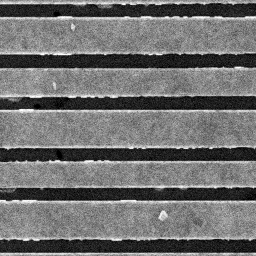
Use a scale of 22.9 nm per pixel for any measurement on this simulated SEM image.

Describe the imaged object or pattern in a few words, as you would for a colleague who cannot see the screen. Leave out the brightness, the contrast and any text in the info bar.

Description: lines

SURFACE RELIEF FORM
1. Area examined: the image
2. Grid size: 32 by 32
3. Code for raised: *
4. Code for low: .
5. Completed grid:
................................
................................
********************************
********************************
********************************
********************************
********************************
................................
................................
********************************
********************************
********************************
................................
................................
********************************
********************************
********************************
********************************
**..............................
................................
********************************
********************************
********************************
................................
................................
********************************
********************************
********************************
********************************
********************************
................................
................................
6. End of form